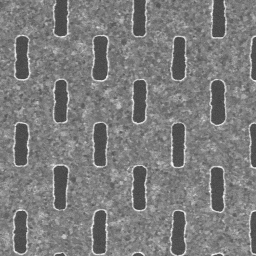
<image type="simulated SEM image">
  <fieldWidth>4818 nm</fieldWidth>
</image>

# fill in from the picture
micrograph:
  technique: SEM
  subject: a regular array of holes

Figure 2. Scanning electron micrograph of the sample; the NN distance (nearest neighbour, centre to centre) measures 1.09 microns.